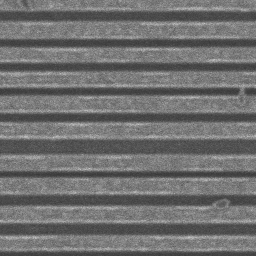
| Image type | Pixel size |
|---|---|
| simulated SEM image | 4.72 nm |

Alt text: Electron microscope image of parallel lines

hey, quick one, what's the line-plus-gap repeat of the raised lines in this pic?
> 126 nm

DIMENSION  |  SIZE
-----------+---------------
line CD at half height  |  79.1 nm